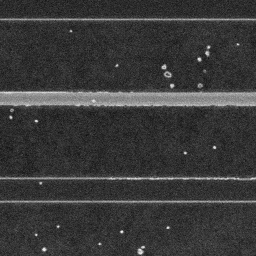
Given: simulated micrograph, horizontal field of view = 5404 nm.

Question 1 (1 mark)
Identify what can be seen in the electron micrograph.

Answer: lines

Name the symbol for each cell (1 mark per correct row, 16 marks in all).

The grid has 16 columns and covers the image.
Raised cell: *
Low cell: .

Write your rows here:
****************
................
................
................
................
................
................
................
................
................
................
****************
****************
................
................
................